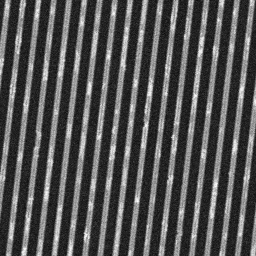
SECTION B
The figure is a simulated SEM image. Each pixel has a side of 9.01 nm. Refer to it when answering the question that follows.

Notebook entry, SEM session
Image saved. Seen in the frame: parallel lines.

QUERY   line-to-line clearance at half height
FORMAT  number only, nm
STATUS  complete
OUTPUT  103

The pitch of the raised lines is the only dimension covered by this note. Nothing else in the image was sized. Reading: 0.137 microns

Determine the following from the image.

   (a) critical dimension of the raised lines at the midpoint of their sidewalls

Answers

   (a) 34.6 nm